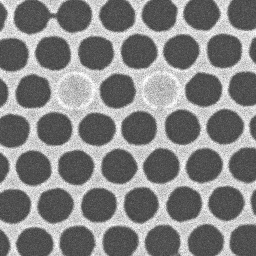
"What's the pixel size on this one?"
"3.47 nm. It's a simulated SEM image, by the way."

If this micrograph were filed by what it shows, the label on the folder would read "a regular array of holes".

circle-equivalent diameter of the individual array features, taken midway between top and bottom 125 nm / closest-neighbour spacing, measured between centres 148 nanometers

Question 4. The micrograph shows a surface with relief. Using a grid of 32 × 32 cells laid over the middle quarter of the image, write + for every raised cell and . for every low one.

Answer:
.++++......+++++......+++++.....
+++++++...+++++++++++++++++++.++
++++++++++++...+++++++++++++++++
+++++++++++......+++++++++++++++
+++++++++........++++++++++++++.
+++++++++.........++++++++++++..
+++++++++.........++++++++++++..
+++++++++.........++++++++++++..
+++++++++.........+++++++++++++.
++++++++++.......++++++++++++++.
+++++++++++.....++++++++++++++++
++++++++++++++++++++++++++++..++
++++++....++++++......++++......
.++++.......+++........+++......
..++.........+.........++.......
..+..........+.........++.......
..+..........+.........++.......
..++.........+.........++.......
.+++........+++........+++......
.++++......+++++......+++++.....
++++++++.+++++++++.+++++++++++++
++..++++++++...++++++++....+++++
......+++++......++++.......++++
.......+++........+++.......+++.
........+.........++.........++.
........+..........+.........+..
........+..........+.........+..
.......++.........++.........++.
.......+++.......++++.......+++.
+.....+++++.....++++++....++++++
+++.+++++++++++++++++++++++++..+
++++++.....++++++.....+++++.....